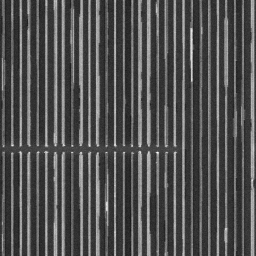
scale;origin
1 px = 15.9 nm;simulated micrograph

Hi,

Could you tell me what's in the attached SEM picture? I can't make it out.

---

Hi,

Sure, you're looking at parallel lines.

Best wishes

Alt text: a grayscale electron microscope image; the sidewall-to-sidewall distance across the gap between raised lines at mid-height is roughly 7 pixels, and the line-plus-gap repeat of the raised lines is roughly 136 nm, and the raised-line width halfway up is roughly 0.0278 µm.